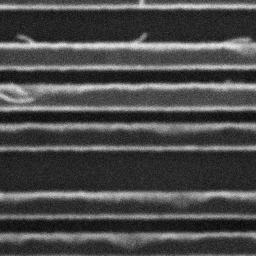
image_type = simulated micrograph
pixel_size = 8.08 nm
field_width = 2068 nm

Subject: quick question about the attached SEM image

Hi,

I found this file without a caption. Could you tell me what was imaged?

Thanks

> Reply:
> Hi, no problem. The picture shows lines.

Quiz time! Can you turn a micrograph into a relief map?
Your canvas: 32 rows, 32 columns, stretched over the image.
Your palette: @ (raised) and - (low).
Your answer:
@@@@@@@@@@@@@@@@@@@@@@@@@@@@@@@@
--------------------------------
--------------------------------
--------------------------------
--------------------------------
---------------@------------@---
@@@@@@@@@@@@@@@@@@@@@@@@@@@@@@@@
@@@@@@@@@@@@@@@@@@@@@@@@@@@@@@@@
@@@@@@@@@@@-----@@@-------------
--------------------------------
--------------------------------
@@@@@@@@@@@@@@@@@@@@@@@@@@@@@@@@
@@@@@@@@@@@@@@@@@@@@@@@@@@@@@@@@
@@@@@@@@@@@@@@@@@@@@@@@@@@@@@@@@
--------------------------------
--------------------------------
@@@@@@@@@@@@@@@@@@@@@@@@@@@@@@@@
@@@@@@@@@@@@@@@@@@@@@@@@@@@@@@@@
@@@@@@@@@@@@-@@@@@@@@@@-@@@@@-@-
--------------------------------
--------------------------------
--------------------------------
--------------------------------
--------------------------------
@-@@@@@@@@@@@@@@@@@@@--@@@@@@@@@
@@@@@@@@@@@@@@@@@@@@@@@@@@@@@@@@
@@@@@@@@@@@@@@@@@@@@@@@@@@@@@@@@
--------------------------------
--------------------------------
---@@@@@@-@@@@-----@@@@@@@@@@@@@
@@@@@@@@@@@@@@@@@@@@@@@@@@@@@@@@
@@@@@@@@@@@@@@@@@@@@@@@@@@@@@@@@